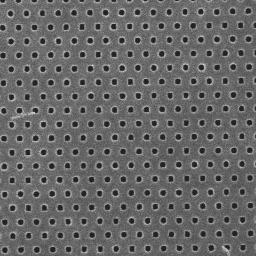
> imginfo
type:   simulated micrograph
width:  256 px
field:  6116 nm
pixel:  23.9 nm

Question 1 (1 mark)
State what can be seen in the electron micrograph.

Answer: a regular array of holes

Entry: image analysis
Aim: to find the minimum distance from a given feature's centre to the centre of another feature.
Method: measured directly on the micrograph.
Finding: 0.37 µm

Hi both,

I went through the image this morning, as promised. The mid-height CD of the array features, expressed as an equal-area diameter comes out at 143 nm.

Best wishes